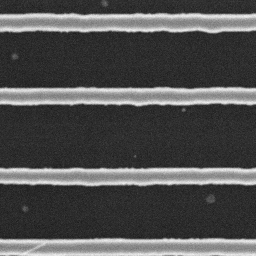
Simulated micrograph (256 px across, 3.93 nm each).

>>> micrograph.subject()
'lines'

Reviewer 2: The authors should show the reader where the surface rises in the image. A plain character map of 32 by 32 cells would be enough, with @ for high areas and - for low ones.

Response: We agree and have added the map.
--------------------------------
--------------------------------
@@@@@@@@@@@@@@@@@@@@@@@@@@@@@@@@
@@@@@@@@@@@@@@@@@@@@@@@@@@@@@@@@
--------------------------------
--------------------------------
--------------------------------
--------------------------------
--------------------------------
--------------------------------
--------------------------------
@@@@@@@@@@@@@@@@@@@@@@@@@@@@@@@@
@@@@@@@@@@@@@@@@@@@@@@@@@@@@@@@@
--------------------------------
--------------------------------
--------------------------------
--------------------------------
--------------------------------
--------------------------------
--------------------------------
--------------------------------
@@@@@@@@@@@@@@@@@@@@@@@@@@@@@@@@
@@@@@@@@@@@@@@@@@@@@@@@@@@@@@@@@
--------------------------------
--------------------------------
--------------------------------
--------------------------------
--------------------------------
--------------------------------
--------------------------------
@@@@@@@@@@@@@@@@@@@@@@@@@@@@@@@@
@@@@@@@@@@@@@@@@@@@@@@@@@@@@@@@@